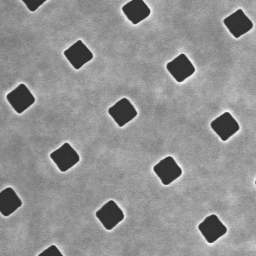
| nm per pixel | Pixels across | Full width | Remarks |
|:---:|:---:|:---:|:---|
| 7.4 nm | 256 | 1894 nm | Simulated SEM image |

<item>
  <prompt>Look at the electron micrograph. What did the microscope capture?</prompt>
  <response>a regular array of holes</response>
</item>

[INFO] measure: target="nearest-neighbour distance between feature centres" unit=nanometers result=538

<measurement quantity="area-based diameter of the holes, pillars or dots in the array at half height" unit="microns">0.189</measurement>